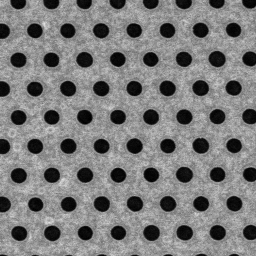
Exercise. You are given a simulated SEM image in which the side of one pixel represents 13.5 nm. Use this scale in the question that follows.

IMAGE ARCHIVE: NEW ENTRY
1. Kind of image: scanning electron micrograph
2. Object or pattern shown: a regular array of holes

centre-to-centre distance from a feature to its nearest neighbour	0.444	um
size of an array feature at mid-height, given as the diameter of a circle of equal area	211	nanometers